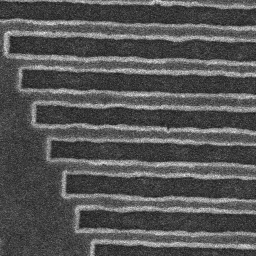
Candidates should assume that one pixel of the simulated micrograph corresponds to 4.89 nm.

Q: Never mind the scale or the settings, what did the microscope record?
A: parallel lines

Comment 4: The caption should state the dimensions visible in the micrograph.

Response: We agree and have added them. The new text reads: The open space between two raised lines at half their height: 99.7 nm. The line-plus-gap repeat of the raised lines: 169 nm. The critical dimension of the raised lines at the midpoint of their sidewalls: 0.0709 micrometres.